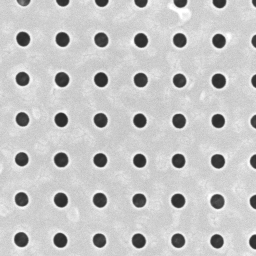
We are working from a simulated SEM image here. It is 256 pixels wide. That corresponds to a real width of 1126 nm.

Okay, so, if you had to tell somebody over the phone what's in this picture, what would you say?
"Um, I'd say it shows a regular array of holes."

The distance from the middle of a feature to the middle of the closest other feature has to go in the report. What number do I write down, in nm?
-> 172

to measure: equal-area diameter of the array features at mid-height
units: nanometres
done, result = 62